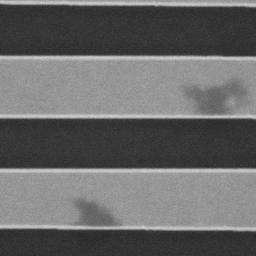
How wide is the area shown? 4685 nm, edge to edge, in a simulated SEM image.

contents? lines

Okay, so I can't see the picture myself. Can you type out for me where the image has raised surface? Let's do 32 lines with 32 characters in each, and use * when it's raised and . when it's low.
.*******************************
................................
................................
................................
................................
................................
................................
********************************
********************************
********************************
********************************
********************************
********************************
********************************
********************************
................................
................................
................................
................................
................................
................................
********************************
********************************
********************************
********************************
********************************
********************************
********************************
********************************
................................
................................
................................